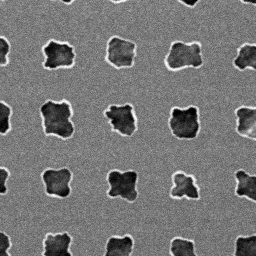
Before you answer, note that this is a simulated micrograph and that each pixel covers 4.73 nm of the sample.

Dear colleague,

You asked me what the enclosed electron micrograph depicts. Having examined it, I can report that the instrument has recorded a regular array of holes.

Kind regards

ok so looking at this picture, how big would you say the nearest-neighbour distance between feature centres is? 297 nanometers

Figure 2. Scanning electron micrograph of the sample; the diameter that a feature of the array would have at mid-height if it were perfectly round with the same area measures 139 nm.